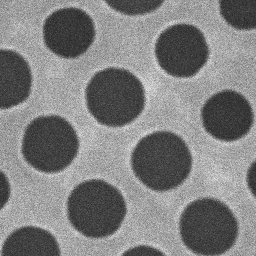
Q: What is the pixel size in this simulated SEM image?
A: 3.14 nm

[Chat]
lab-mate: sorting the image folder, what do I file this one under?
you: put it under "holes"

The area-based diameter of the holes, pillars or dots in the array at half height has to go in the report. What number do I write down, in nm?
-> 182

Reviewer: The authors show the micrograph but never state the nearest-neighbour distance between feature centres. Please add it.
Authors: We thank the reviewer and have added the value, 79.4 px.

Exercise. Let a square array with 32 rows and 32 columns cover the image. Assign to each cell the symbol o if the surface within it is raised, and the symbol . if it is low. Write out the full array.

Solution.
ooooooooooooo.......ooooooo.....
ooooooo....oooo....ooooooooo....
oooooo......oooooooooooooooo....
ooooo.......ooooooooo....oooo...
ooooo.......oooooooo......oooooo
oooooo......ooooooo.......oooooo
..ooooo....oooooooo.......oooooo
...ooooooooooooooooo......oooooo
....ooooooooo..ooooo.....ooooooo
....oooooooo.....oooo...oooooooo
....ooooooo.......oooooooooooooo
....ooooooo.......ooooooooo...oo
...oooooooo.......oooooooo.....o
.oooooooooo.......ooooooo......o
oooooo..oooo.....oooooooo.......
oooo.....oooo...ooooooooo.......
ooo......oooooooooo...oooo.....o
ooo.......ooooooo......oooo..ooo
ooo.......ooooooo.......oooooooo
ooo.......oooooo........oooooooo
oooo.....ooooooo........ooooooo.
ooooo..oooooooooo.......ooooooo.
.oooooooooo..oooo......oooooooo.
.oooooooo......oooo...ooooooooo.
.oooooooo......ooooooooooooooooo
.ooooooo........oooooooo....oooo
oooooooo........ooooooo......ooo
ooooooooo......ooooooo........oo
oo...oooo......ooooooo........oo
o......oooo...ooooooooo.......oo
.......oooooooooooooooo......ooo
........oooooooo....oooo....oooo